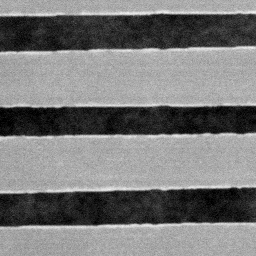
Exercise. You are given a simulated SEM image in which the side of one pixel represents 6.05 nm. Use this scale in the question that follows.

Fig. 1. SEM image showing lines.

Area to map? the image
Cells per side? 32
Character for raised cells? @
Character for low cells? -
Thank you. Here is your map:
@@@@@@@@@@@@@@@@@@@@@@@@@@@@@@@@
@@@@@@@@@@@@@@@@@@@@@@@@@@@@@@@@
--------------------------------
--------------------------------
--------------------------------
--------------------------------
-------@@@@@@@@@@@@@@@@@@@@@@@@@
@@@@@@@@@@@@@@@@@@@@@@@@@@@@@@@@
@@@@@@@@@@@@@@@@@@@@@@@@@@@@@@@@
@@@@@@@@@@@@@@@@@@@@@@@@@@@@@@@@
@@@@@@@@@@@@@@@@@@@@@@@@@@@@@@@@
@@@@@@@@@@@@@@@@@@@@@@@@@@@@@@@@
@@@@@@@@@@@@@@@@@@@@@@@@@@@@@@@@
--------------------------------
--------------------------------
--------------------------------
--------------------------------
@@@@@@@@@@@@@@@@@@@@@@@@@@@@@@@@
@@@@@@@@@@@@@@@@@@@@@@@@@@@@@@@@
@@@@@@@@@@@@@@@@@@@@@@@@@@@@@@@@
@@@@@@@@@@@@@@@@@@@@@@@@@@@@@@@@
@@@@@@@@@@@@@@@@@@@@@@@@@@@@@@@@
@@@@@@@@@@@@@@@@@@@@@@@@@@@@@@@@
@@@@@@@@@@@@@@@@@@@@@@@---------
--------------------------------
--------------------------------
--------------------------------
--------------------------------
@@@@@@@@@@@@@@@@@@@@@@@@@@@@@@@@
@@@@@@@@@@@@@@@@@@@@@@@@@@@@@@@@
@@@@@@@@@@@@@@@@@@@@@@@@@@@@@@@@
@@@@@@@@@@@@@@@@@@@@@@@@@@@@@@@@